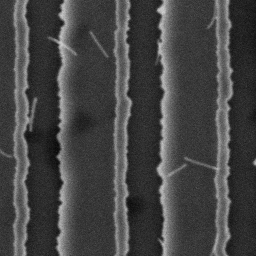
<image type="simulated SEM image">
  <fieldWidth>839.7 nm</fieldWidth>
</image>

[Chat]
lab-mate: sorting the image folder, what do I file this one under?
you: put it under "lines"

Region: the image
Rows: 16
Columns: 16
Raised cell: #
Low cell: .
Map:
##..####..####..
##..####..####..
##..####..####..
##..####..####..
##..####..####..
##..####..#####.
##..####..####..
##..####..####..
##..####..####..
##..####..####..
##..####..####..
##..####..####..
##..####..####..
##..####..####..
##..####..####..
##..####..####..